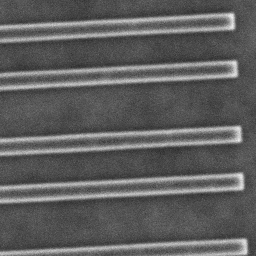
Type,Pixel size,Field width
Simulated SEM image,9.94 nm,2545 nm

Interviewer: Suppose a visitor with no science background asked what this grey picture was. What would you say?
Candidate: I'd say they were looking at parallel lines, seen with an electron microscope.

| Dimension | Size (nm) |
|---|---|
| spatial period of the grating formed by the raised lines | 535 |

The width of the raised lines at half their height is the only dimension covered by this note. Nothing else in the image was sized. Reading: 148 nm